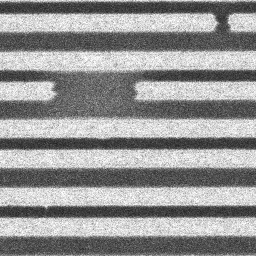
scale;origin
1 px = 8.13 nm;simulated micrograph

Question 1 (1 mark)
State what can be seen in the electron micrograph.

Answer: parallel lines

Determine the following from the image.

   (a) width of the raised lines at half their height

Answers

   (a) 20.8 px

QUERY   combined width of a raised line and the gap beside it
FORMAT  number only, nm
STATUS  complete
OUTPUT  276